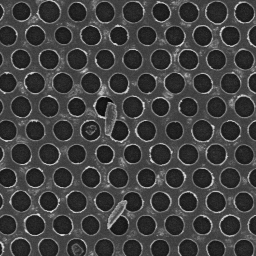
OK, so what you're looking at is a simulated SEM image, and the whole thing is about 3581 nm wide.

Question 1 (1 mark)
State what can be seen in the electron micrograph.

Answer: a regular array of holes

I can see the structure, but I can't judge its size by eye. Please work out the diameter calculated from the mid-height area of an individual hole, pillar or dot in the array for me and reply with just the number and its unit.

271 nm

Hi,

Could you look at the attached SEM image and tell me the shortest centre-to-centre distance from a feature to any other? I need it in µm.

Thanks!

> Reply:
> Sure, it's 0.381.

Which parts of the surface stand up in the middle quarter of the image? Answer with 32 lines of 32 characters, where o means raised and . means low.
o....oooo...oooo...ooo....ooo...
oooooooooo.ooooooooooooo.ooooooo
.ooooo..ooooo.oooooo.oooooo..ooo
..oo.....ooo....ooo....oo.....oo
..oo.....oo.....ooo....oo.....oo
..oo.....oo.....ooo....oo.....oo
..ooo....ooo....ooo...oooo....oo
oooooooooooooooooooooooooooooooo
ooo.ooooo..ooooo..oooooooooooooo
o....ooo....ooo....ooo....ooo...
o.....oo...oooo.....oo....ooo...
o....ooo...oooo.....oo....ooo...
oo...ooo..ooooo....oooo...oooo..
oooooooooooooooooooooooooooooooo
.ooooo..ooooo..ooooo..ooooo.oooo
..oo.....oooo...oo.....ooo....oo
..oo.....ooo....oo.....ooo....oo
..oo.....ooo....oo.....ooo....oo
..ooo...oooo....ooo...oooo...ooo
oooooooooooooooooooooooooooooooo
oo..ooooo..ooooo..oooo....oooo..
o....ooo....ooo....ooo.....oo...
o....ooo.....oo....ooo.....o....
o....ooo....ooo....ooo.....oo...
oo..ooooo...oooo..ooooo...oooo..
oooooooooooooooooooooooooooooooo
.oooo...oooo...oooo...oooo...ooo
..ooo....oo.....oo.....ooo....oo
..oo.....oo.....oo.....oo.....oo
..ooo....oo.....ooo....ooo....oo
.ooooo..oooo...oooo...oooo...ooo
oooooooooooooooooooooooooooooooo